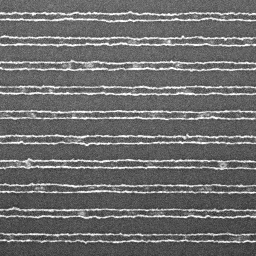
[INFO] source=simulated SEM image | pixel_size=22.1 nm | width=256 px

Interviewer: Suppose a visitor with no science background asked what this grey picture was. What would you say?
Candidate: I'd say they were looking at parallel lines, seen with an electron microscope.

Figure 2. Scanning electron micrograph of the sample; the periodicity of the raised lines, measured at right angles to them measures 0.544 microns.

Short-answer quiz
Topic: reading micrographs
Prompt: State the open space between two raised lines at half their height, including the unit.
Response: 382 nm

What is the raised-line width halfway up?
155 nm